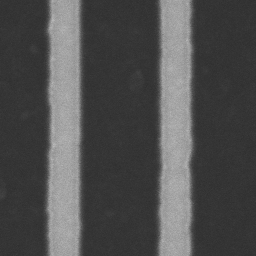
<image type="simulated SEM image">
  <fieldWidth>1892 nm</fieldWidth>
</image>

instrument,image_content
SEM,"one or a few lines or trenches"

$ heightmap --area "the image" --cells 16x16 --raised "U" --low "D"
UUUDDUUUUUDDUUUU
UUUDDUUUUUDDUUUU
UUUDDUUUUUDDUUUU
UUUDDUUUUUDDUUUU
UUUDDUUUUUDDUUUU
UUUDDUUUUUDDUUUU
UUUDDUUUUUDDUUUU
UUUDDUUUUUDDUUUU
UUUDDUUUUUDDUUUU
UUUDDUUUUUDDUUUU
UUUDDUUUUUDDUUUU
UUUDDUUUUUDDUUUU
UUUDDUUUUUDDUUUU
UUUDDUUUUUDDUUUU
UUUDDUUUUUDDUUUU
UUUDDUUUUUDDUUUU